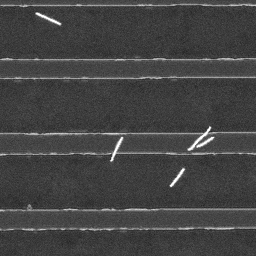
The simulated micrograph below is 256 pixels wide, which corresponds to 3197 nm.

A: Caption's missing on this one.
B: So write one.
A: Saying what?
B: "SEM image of lines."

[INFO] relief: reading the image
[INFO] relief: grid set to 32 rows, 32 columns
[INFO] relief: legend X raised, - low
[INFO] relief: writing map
XXXXXXXXXXXXXXXXXXXXXXXXXXXXXXXX
--------------------------------
--------------------------------
--------------------------------
--------------------------------
--------------------------------
--------------------------------
XXXXXXXXXXXXXXXXXXXXXXXXXXXXXXXX
XXXXXXXXXXXXXXXXXXXXXXXXXXXXXXXX
XXXXXXXXXXXXXXXXXXXXXXXXXXXXXXXX
--------------------------------
--------------------------------
--------------------------------
--------------------------------
--------------------------------
--------------------------------
--------------------------------
XXXXXXXXXXXXXXXXXXXXXXXXXXXXXXXX
XXXXXXXXXXXXXXXXXXXXXXXXXXXXXXXX
--------------------------------
--------------------------------
--------------------------------
--------------------------------
--------------------------------
--------------------------------
--------------------------------
XXXXXXXXXXXXXXXXXXXXXXXXXXXXXXXX
XXXXXXXXXXXXXXXXXXXXXXXXXXXXXXXX
XXXXXXXXXXXXXXXXXXXXXXXX-XXXX---
--------------------------------
--------------------------------
--------------------------------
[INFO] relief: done